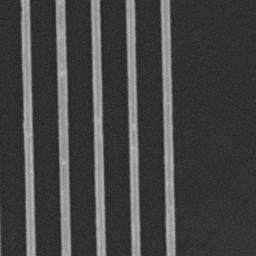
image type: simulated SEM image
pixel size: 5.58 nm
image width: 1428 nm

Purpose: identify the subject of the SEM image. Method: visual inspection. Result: parallel lines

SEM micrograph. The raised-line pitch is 195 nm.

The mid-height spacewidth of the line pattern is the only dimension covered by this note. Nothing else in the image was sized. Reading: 28.1 px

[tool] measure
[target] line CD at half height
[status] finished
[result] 37.7 nm